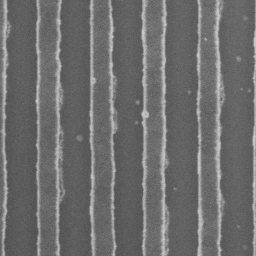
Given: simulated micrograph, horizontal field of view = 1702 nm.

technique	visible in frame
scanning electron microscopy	lines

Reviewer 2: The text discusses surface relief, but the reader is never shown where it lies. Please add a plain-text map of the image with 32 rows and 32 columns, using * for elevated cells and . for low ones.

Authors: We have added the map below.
*....***...***....***....**.....
*....***...***....***....**.....
*....**....***....***....**.....
*....**....***....***....**.....
*....***...***....***....**.....
*....**....***....***....**.....
*....**....***....***....**.....
*....**....***....***....**.....
*....***...***....***....**.....
*....**....***....***....**.....
*....**....***....***....**.....
*....**....***....***....**.....
*....**....***....***....**.....
*....**....***....***....**.....
*....**....***....***....**.....
*....**....***....***....**.....
*....**....***....***....**.....
*....**....***....***....**.....
*....**....***....***....**.....
*....**.....**....***....**.....
*....**.....**....***....**.....
*....**.....**....**.....**.....
*....**.....**....***....**.....
*....**.....**....***....***....
*....**....***....***....***....
*....**....***....***....***....
*....**....***....***....***....
*....**....***....***....***....
*....**.....**....***....***....
*....**.....**....***....***....
.....**.....**....***....**.....
*....**.....**....***....***....